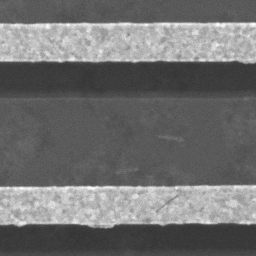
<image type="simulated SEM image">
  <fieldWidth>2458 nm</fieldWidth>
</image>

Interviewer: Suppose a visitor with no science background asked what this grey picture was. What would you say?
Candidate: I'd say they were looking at lines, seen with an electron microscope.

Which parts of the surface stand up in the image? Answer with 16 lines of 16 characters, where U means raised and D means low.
UUUUUUUUUUUUUUUU
UUUUUUUUUUUUUUUU
UUUUUUUUUUUUUUUU
UUUUUUUUUUUUUUUU
DDDDDDDDDDDDDDDD
DDDDDDDDDDDDDDDD
UUUUUUUUUUUUUUUU
UUUUUUUUUUUUUUUU
UUUUUUUUUUUUUUUU
UUUUUUUUUUUUUUUU
UUUUUUUUUUUUUUUU
UUUUUUUUUUUUUUUU
UUUUUUUUUUUUUUUU
UUUUUUUUUUUUUUUU
DDDDDDDDDDDDDDDD
DDDDDDDDDDDDDDDD